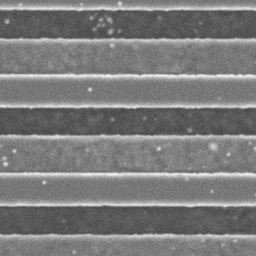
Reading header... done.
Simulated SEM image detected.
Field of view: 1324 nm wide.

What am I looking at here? lines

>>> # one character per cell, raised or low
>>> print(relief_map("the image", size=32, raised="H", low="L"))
HHHHHHHHHHHHHHHHHHHHHHHHHHHHHHHH
LLLLLLLLLLLLLLLLLLLLLLLLLLLLLLLL
LLLLLLLLLLLLLLLLLLLLLLLLLLLLLLLL
LLLLLLLLLLLLLLLLLLLLLLLLLLLLLLLL
LLLLLLLLLLLLLLLLLLLLLLLLLLLLLLLL
HHHHHHHHHHHHHHHHHHHHHHHHHHHHHHHH
HHHHHHHHHHHHHHHHHHHHHHHHHHHHHHHH
HHHHHHHHHHHHHHHHHHHHHHHHHHHHHHHH
HHHHHHHHHHHHHHHHHHHHHHHHHHHHHHHH
HHHHHHHHHHHHHHHHHHHHHHHHHHHHHHHH
HHHHHHHHHHHHHHHHHHHHHHHHHHHHHHHH
HHHHHHHHHHHHHHHHHHHHHHHHHHHHHHHH
HHHHHHHHHHHHHHHHHHHHHHHHHHHHHHHH
LLLLLLLLLLLLLLLLLLLLLLLLLLLLLLLL
LLLLLLLLLLLLLLLLLLLLLLLLLLLLLLLL
LLLLLLLLLLLLLLLLLLLLLLLLLLLLLLLL
LLLLLLLLLLLLLLLLLLLLLLLLLLLLLLLL
HHHHHHHHHHHHHHHHHHHHHHHHHHHHHHHH
HHHHHHHHHHHHHHHHHHHHHHHHHHHHHHHH
HHHHHHHHHHHHHHHHHHHHHHHHHHHHHHHH
HHHHHHHHHHHHHHHHHHHHHHHHHHHHHHHH
HHHHHHHHHHHHHHHHHHHHHHHHHHHHHHHH
HHHHHHHHHHHHHHHHHHHHHHHHHHHHHHHH
HHHHHHHHHHHHHHHHHHHHHHHHHHHHHHHH
HHHHHHHHHHHHHHHHHHHHHHHHHHHHHHHH
HHHHHHHHHHHHHHHHHHHHHHHHHHHHHHHH
LLLLLLLLLLLLLLLLLLLLLLLLLLLLLLLL
LLLLLLLLLLLLLLLLLLLLLLLLLLLLLLLL
LLLLLLLLLLLLLLLLLLLLLLLLLLLLLLLL
HHHHHHHHHHHHHHHHHHHHHHHHHHHHHHHH
HHHHHHHHHHHHHHHHHHHHHHHHHHHHHHHH
HHHHHHHHHHHHHHHHHHHHHHHHHHHHHHHH